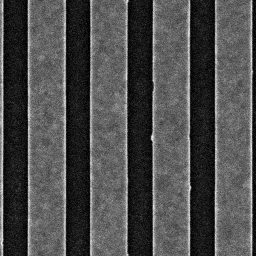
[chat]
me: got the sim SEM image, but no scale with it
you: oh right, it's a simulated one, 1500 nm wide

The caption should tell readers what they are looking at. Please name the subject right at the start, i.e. parallel lines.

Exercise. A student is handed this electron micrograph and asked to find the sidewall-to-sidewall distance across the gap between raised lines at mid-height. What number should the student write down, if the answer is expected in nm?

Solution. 152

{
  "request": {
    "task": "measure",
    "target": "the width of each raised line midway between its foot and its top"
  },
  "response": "215 nm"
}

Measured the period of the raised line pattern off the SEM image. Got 365 nm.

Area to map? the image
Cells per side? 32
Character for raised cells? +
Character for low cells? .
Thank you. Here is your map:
....++++...+++++...+++++...++++.
....++++...+++++...+++++...++++.
....++++...+++++...+++++...++++.
....++++...+++++...+++++...++++.
....++++...+++++...+++++...++++.
....++++...+++++...+++++...++++.
....++++...+++++...+++++...++++.
....++++...+++++...+++++...++++.
....++++...+++++...+++++...++++.
....++++...+++++...+++++...++++.
....++++...+++++...+++++...++++.
....++++...+++++...+++++...++++.
....++++...+++++...+++++...++++.
....++++...+++++...+++++...++++.
....++++...+++++...+++++...++++.
....++++...+++++...+++++...++++.
....++++...+++++...+++++...++++.
....++++...+++++...+++++...++++.
....++++...+++++...+++++...++++.
....++++...+++++...+++++...++++.
....++++...+++++...+++++...++++.
....++++...+++++...+++++...++++.
....++++...+++++...+++++...++++.
....++++...+++++...+++++...++++.
....++++...+++++...+++++...++++.
....++++...+++++...+++++...++++.
....++++...+++++...+++++...++++.
....++++...+++++...+++++...++++.
....++++...+++++...+++++...++++.
....++++...+++++...+++++...++++.
....++++...+++++...+++++...++++.
....++++...+++++...+++++...++++.